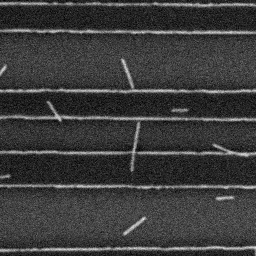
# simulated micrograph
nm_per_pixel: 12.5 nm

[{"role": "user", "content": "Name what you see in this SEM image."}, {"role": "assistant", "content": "lines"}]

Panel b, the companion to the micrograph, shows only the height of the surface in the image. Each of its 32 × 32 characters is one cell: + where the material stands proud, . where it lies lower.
+++++...........................
++++++++++++++++++++++++++++++++
++++++++++++++++++++++++++++++++
++++++++++++++++++++++++++++++++
................................
................................
................................
................................
................................
................................
................................
++++++++++++++++++++++++++++++++
++++++++++++++++++++++++++++++++
++++++++++++++++++++++++++++++++
++++++++++++++++++++++++++++++++
................................
................................
................................
................................
++++++++++++++++++++++++++++++++
++++++++++++++++++++++++++++++++
++++++++++++++++++++++++++++++++
++++++++++++++++++++++++++++++++
................................
................................
................................
................................
................................
................................
................................
................................
++++++++++++++++++++++++++++++++